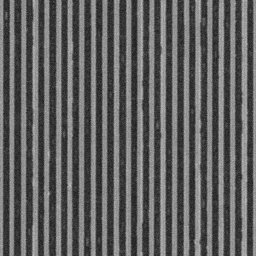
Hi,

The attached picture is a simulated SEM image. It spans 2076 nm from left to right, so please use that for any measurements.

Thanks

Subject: parallel lines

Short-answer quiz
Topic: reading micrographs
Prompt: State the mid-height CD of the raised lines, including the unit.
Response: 37.5 nanometres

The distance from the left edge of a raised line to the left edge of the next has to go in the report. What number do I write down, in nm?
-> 94.5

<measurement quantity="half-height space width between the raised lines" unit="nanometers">59.8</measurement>